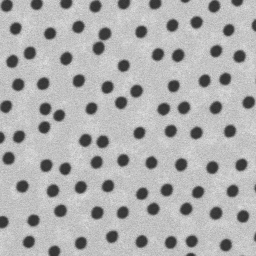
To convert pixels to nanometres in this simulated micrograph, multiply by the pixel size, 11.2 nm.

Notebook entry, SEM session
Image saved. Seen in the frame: a regular array of holes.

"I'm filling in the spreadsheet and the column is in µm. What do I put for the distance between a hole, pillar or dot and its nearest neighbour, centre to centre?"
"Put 0.269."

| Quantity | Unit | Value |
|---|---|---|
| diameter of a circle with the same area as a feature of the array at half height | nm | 136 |